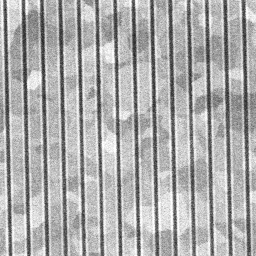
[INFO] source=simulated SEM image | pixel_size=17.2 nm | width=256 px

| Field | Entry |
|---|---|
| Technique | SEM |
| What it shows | parallel lines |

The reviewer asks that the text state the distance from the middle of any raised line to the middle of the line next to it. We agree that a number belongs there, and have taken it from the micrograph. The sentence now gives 18.3 px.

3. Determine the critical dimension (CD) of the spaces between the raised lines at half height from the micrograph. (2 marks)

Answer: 5.87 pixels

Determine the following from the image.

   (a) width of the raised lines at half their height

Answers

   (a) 12.6 px